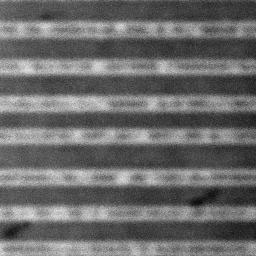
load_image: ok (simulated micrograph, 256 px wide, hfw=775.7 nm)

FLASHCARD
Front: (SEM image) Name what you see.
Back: parallel lines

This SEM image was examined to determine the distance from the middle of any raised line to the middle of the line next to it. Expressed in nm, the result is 111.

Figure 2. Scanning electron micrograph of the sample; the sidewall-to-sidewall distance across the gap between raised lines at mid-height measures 0.0745 µm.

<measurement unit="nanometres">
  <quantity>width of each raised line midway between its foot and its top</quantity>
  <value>35.9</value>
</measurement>